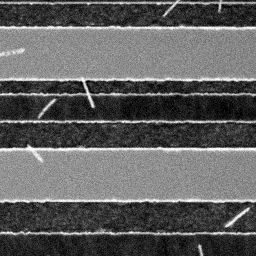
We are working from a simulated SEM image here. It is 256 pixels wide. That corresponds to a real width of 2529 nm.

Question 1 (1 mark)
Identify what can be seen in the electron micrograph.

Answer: lines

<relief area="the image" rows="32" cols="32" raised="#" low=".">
.....................#.....#....
................................
................................
################################
################################
################################
################################
################################
################################
################################
................................
..........#.....................
################################
################################
################################
................................
................................
................................
...#...............#............
################################
################################
################################
################################
################################
################################
................................
................................
................................
................................
################################
################################
################################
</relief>